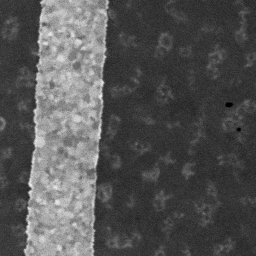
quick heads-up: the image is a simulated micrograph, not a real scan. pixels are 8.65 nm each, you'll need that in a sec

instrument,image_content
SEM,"one or a few lines or trenches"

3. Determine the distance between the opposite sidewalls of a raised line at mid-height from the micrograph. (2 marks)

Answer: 554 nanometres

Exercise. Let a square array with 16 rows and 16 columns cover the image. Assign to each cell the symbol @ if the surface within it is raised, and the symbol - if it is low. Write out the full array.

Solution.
---@@@@---------
---@@@@---------
--@@@@@---------
--@@@@@---------
--@@@@----------
--@@@@----------
--@@@@----------
--@@@@----------
--@@@@----------
--@@@@----------
--@@@@----------
--@@@@----------
--@@@@----------
--@@@@----------
--@@@@----------
--@@@@----------